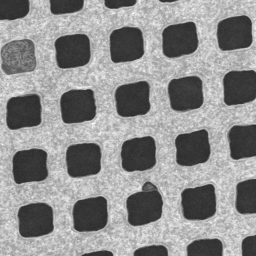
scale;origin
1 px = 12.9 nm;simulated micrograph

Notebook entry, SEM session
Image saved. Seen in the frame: a regular array of holes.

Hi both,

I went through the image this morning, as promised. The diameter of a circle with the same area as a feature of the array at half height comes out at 0.479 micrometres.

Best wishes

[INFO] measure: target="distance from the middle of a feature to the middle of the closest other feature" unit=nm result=697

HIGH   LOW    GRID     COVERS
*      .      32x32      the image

....**....***....***************
....**....**********************
.***************************...*
***************..****....**.....
********...***....**.....**.....
*...***....***....**.....**....*
....***....***....**....********
.....**....***...***************
....****.***********************
****************************....
****************...**....***....
********....**.....**....***....
*....***....**.....**....***....
*....***....***....**....*******
*....***....***..***************
*....***************************
************************..***...
****************...***....***...
********.....**....***....***...
**....**.....**....***....***...
**....**.....**....***...*******
**....**....********************
**...**************************.
******************..****...***..
****************....***....***..
****..***....***....***....**...
**.....**....***....***....***..
**.....**....***....****.*******
**.....**....*******************
***..**************************.
************************....**..
************..***....**.....**..